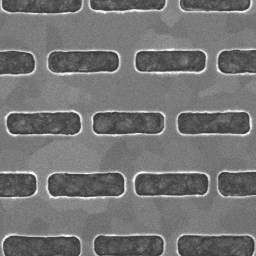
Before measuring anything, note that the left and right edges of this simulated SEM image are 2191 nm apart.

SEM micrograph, holes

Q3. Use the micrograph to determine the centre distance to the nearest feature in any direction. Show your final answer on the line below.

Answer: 632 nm